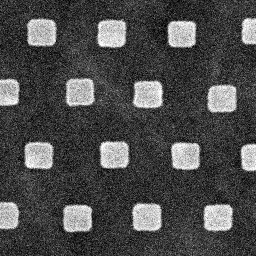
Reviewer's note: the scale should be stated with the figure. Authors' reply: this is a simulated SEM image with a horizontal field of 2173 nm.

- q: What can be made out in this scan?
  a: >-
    a regular array of raised bodies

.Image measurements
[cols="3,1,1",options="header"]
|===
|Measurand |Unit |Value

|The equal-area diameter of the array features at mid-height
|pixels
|28.7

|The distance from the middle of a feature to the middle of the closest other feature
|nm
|588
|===